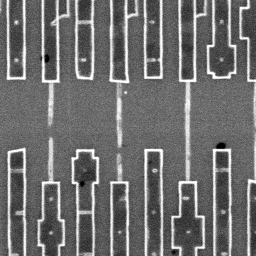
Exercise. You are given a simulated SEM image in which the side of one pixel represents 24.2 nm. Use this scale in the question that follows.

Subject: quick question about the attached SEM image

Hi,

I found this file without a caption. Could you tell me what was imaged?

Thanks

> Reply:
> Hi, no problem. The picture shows wiring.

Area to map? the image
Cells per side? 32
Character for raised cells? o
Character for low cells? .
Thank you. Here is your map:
.oo..oo...oo..oo..oo..oo...oo..o
.oo..oo...oo..oo..oo..oo...oo.oo
.oo..oo...o...oo..oo..oo...oo.oo
.oo..oo...oo..oo..oo..oo...oo.oo
.oo..oo...oo..oo..oo..oo...oo.oo
.oo..oo...oo..oo..oo...o..ooo..o
.oo..oo...oo..oo..oo...o..ooo..o
.oo..oo...oo..oo..oo...o..ooo..o
.oo..oo...oo..oo..oo...o..ooo..o
.oo..oo...o...oo..oo...o...oo..o
................................
................................
................................
................................
................................
................................
................................
................................
................................
.oo.......oo......oo.......oo...
.oo......ooo......oo.......oo...
.oo......ooo......oo.......oo...
.oo......ooo......oo.......oo...
.oo..oo...oo..oo..oo..oo...oo..o
.oo..oo...oo..oo..oo...o...oo..o
.oo..oo...oo..oo..oo...oo..oo..o
.oo..oo...oo..oo..oo..ooo..oo..o
.oo..ooo..oo..oo..oo..ooo..oo..o
.oo..ooo..oo..oo..oo..ooo..oo..o
.oo..ooo..oo..oo..oo..ooo..oo..o
.oo..ooo..oo..oo..oo..ooo..oo..o
.oo..oo...oo..oo..oo...oo..oo..o